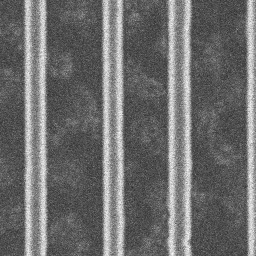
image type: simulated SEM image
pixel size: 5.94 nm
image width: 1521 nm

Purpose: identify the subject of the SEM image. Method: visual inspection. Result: one or a few lines or trenches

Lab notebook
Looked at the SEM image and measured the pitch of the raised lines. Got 427 nm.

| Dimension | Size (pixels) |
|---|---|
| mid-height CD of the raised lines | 15.7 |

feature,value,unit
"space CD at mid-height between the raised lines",62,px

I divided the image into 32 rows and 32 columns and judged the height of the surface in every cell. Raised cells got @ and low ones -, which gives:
---@@--------@@------@@@-------@
---@@--------@@------@@@-------@
---@@--------@@------@@--------@
---@@--------@@------@@--------@
---@@--------@@------@@--------@
---@@--------@@------@@--------@
---@@--------@@------@@--------@
---@@--------@@------@@--------@
---@@--------@@------@@--------@
---@@--------@@------@@--------@
---@@--------@@------@@--------@
---@@--------@@------@@@-------@
---@@--------@@------@@--------@
---@@--------@@------@@@-------@
---@@--------@@------@@@-------@
---@@--------@@------@@@-------@
---@@--------@@------@@@-------@
---@@--------@@------@@@-------@
---@@--------@@------@@@-------@
---@@@-------@@------@@@-------@
----@@-------@@------@@@-------@
---@@@-------@@------@@@-------@
---@@@-------@@------@@@-------@
---@@@-------@@------@@@-------@
---@@@-------@@------@@@-------@
---@@@-------@@------@@@-------@
---@@@-------@@------@@@-------@
---@@@-------@@------@@@-------@
---@@--------@@------@@@-------@
---@@@-------@@------@@@-------@
---@@@-------@@------@@--------@
---@@--------@@------@@@-------@